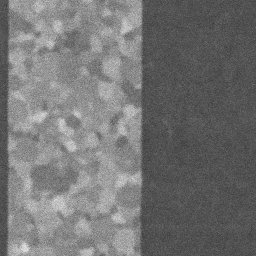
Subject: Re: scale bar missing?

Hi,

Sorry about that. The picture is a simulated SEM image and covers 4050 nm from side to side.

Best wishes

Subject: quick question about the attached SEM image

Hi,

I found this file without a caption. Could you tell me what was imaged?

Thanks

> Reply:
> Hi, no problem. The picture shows one or a few lines or trenches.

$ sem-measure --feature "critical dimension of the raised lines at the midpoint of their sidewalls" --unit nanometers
2080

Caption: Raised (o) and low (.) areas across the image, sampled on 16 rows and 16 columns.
.oooooooo.......
.oooooooo.......
.oooooooo.......
.oooooooo.......
.oooooooo.......
.oooooooo.......
.oooooooo.......
.oooooooo.......
.oooooooo.......
.oooooooo.......
.oooooooo.......
.oooooooo.......
.oooooooo.......
.oooooooo.......
.oooooooo.......
.oooooooo.......